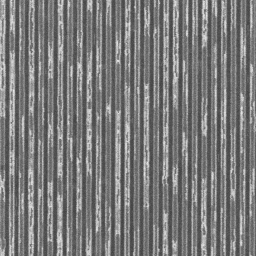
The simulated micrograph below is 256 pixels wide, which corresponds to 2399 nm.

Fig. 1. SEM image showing parallel lines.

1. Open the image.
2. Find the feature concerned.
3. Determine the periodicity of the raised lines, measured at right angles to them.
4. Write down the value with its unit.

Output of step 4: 90.1 nanometers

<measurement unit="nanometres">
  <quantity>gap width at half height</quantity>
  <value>43.3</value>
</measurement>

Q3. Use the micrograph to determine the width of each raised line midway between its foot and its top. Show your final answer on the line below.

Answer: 0.0445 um